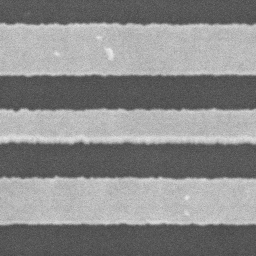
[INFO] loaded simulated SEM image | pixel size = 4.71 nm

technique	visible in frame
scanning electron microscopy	lines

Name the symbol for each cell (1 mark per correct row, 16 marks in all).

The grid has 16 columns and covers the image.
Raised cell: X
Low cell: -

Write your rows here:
----------------
------X---------
XXXXXXXXXXXXXXXX
XXXXXXXXXXXXXXXX
XXXXXXXXXXXXXXXX
----------------
----------------
XXXXXXXXXXXXXXXX
XXXXXXXXXXXXXXXX
----------------
----------------
XXXXXXXXXXXXXXXX
XXXXXXXXXXXXXXXX
XXXXXXXXXXXXXXXX
----------------
----------------